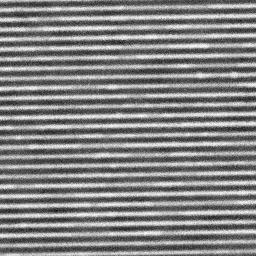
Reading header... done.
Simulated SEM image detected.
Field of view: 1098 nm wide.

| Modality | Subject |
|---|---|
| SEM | parallel lines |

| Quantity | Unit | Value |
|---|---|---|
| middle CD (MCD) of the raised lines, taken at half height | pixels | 2.24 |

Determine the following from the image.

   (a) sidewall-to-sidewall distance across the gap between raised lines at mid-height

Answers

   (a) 32.1 nanometres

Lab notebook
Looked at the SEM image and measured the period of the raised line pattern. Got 42.1 nanometers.